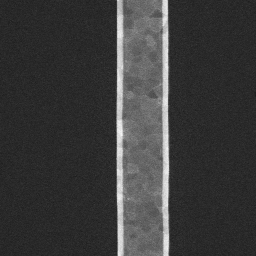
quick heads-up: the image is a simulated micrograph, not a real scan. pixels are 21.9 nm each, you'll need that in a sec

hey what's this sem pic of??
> one or a few lines or trenches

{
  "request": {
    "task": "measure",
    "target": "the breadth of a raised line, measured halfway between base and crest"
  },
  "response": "1020 nm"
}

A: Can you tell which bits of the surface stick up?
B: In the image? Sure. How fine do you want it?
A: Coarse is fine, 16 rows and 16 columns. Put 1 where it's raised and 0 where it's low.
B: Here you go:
0000000111000000
0000000011000000
0000000011000000
0000000011000000
0000000011000000
0000000111000000
0000000111000000
0000000111000000
0000000111000000
0000000111000000
0000000111000000
0000000111000000
0000000111000000
0000000011000000
0000000011000000
0000000011000000